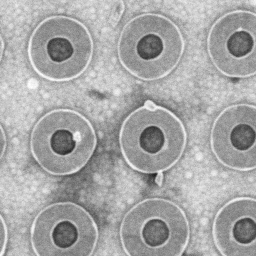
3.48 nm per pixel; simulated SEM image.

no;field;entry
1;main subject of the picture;ring-shaped raised bodies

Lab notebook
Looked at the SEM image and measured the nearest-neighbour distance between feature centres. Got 312 nanometers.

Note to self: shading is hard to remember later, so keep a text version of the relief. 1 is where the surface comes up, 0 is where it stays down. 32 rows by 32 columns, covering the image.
00000000000000000000000000000000
00000000000000000000000000000110
00000011100000001111100000011111
00000111111000001111110000111111
00001111111000011100111000111001
00001100011000011000111000110000
00001100011000011000111000111001
00001110111000011111110000011111
00001111111000001111110000011111
00000111110000000111000000000110
00000000000000000000000000000000
00000000000000000000000000000000
00000000000000000000000000000000
00000000000000000011000000001111
00000011110000001111110000011111
00000111111000011111111000011101
00001110011100011100111000111000
10001100011100011000011000111000
10001100011100011100111000011001
00001111111000001111111000011111
00000111111000001111110000001111
00000011100000000011000000000000
00000000000000000001000000000000
00000000000000000000000000000000
00000000000000000000000000000000
00000001100000000111110000001111
00000111111000001111111000011111
00001111111100011110111000011100
10001110001100011100011100011000
10001100001100011100011100011000
10001110011100011100111000011101
00001111111100001111111000001111